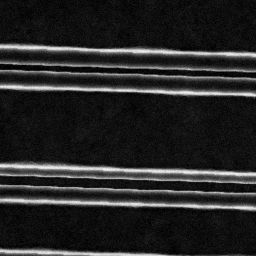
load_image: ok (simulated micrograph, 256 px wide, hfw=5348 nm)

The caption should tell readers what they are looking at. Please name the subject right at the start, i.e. lines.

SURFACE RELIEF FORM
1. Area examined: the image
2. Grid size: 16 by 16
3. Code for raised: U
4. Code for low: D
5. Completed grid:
DDDDDDDDDDDDDDDD
DDDDDDDDDDDDDDDD
DDDDDDDDDDDDDDDD
UUUUUUUUUUUUUUUU
UUUUUUUUUUUUUUUU
DDDDUUUUUUUUUUUU
DDDDDDDDDDDDDDDD
DDDDDDDDDDDDDDDD
DDDDDDDDDDDDDDDD
DDDDDDDDDDDDDDDD
UUUUDDDDDDDDDDDD
UUUUUUUUUUUUUUUU
UUUUUUUUUUUUUUUU
DDDDDDDDDDDDDDDD
DDDDDDDDDDDDDDDD
DDDDDDDDDDDDDDDD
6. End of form